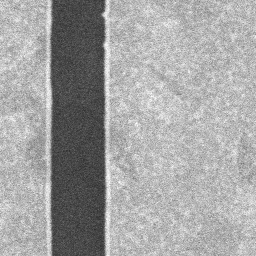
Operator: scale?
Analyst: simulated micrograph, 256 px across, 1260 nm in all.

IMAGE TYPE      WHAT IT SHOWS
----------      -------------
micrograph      one or a few lines or trenches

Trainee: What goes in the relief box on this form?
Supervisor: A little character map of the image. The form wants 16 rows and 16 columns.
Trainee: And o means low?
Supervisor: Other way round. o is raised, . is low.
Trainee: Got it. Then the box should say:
ooo....ooooooooo
ooo....ooooooooo
ooo....ooooooooo
ooo....ooooooooo
ooo....ooooooooo
ooo....ooooooooo
ooo....ooooooooo
ooo....ooooooooo
ooo....ooooooooo
ooo....ooooooooo
ooo....ooooooooo
ooo....ooooooooo
ooo....ooooooooo
ooo....ooooooooo
ooo....ooooooooo
ooo....ooooooooo